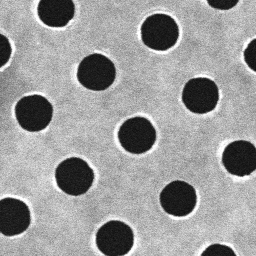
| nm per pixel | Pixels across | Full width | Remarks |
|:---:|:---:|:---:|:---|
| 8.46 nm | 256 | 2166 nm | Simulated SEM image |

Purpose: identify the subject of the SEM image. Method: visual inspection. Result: holes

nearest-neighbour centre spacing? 74.9 px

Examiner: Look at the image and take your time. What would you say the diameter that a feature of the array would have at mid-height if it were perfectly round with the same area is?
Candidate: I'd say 323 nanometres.